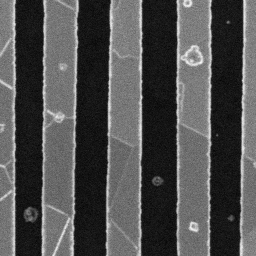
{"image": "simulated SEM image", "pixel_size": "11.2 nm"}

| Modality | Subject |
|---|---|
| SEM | lines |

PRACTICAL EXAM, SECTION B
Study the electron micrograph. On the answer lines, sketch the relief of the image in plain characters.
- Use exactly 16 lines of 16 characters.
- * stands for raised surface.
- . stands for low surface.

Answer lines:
*..**..**..**..*
*..**..**..**..*
*..**..**..**..*
*..**..**..**..*
*..**..**..**..*
*..**..**..**..*
*..**..**..**..*
*..**..**..**..*
*..**..**..**..*
*..**..**..**..*
*..**..**..**..*
*..**..**..**..*
*..**..**..**..*
*..**..**..**..*
*..**..**..**..*
*..**..**..**..*